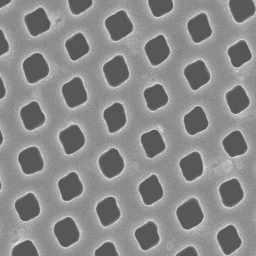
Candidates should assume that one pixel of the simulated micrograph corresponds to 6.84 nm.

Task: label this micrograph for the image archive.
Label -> a regular array of holes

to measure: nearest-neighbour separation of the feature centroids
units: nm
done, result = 312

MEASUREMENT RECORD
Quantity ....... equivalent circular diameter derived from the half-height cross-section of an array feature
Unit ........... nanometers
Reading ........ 169